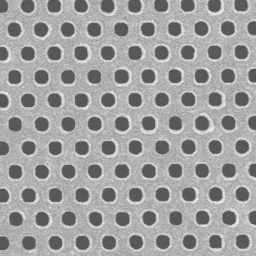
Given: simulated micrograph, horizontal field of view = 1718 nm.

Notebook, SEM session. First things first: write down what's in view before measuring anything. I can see a regular array of holes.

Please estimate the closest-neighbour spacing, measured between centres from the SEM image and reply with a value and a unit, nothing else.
177 nm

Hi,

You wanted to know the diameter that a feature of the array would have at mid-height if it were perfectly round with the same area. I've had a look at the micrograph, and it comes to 94.9 nanometres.